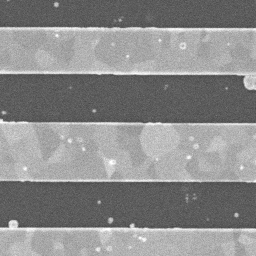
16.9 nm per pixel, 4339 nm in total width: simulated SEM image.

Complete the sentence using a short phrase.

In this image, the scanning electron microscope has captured lines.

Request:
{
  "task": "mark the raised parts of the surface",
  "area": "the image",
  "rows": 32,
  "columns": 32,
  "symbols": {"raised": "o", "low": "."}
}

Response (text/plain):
................................
................................
................................
oooooooooo......................
oooooooooooooooooooooooooooooooo
oooooooooooooooooooooooooooooooo
oooooooooooooooooooooooooooooooo
oooooooooooooooooooooooooooooooo
oooooooooooooooooooooooooooooooo
...............................o
...............................o
................................
................................
................................
................................
oooooooooooooooooooooooooooooooo
oooooooooooooooooooooooooooooooo
oooooooooooooooooooooooooooooooo
oooooooooooooooooooooooooooooooo
oooooooooooooooooooooooooooooooo
oooooooooooooooooooooooooooooooo
oooooooooooooooooooooooooooooooo
oooooooooooooooooooooooooooooooo
................................
................................
................................
................................
................................
................................
oooooooooooooooooooooooooooooooo
oooooooooooooooooooooooooooooooo
oooooooooooooooooooooooooooooooo